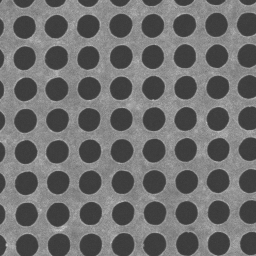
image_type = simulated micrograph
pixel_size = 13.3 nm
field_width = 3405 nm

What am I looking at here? a regular array of holes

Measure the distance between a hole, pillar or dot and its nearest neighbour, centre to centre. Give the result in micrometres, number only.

0.413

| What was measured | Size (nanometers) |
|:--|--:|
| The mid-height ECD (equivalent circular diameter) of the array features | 310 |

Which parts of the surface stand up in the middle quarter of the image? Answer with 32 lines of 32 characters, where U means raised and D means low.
UUUUDDDDUUUUDDDDUUUUDDDDUUUUDDDD
UUUUUDUUUUUUUUUUUUUUUUUUUUUUUUUU
UUUUUUUUUUUUUUUUUUUUUUUUUUUUUUUU
UUUUUDDDUUUUUDDDUUUUUDDDUUUUUDDD
DUUUDDDDDUUUDDDDDUUUDDDDDUUUDDDD
DUUDDDDDDUUUDDDDDUUUDDDDDUUDDDDD
DUUDDDDDDUUDDDDDDUUDDDDDDUUDDDDD
DUUUDDDDDUUUDDDDDUUUDDDDDUUUDDDD
UUUUDDDDUUUUUDDDUUUUUDDDUUUUUDDD
UUUUUUUUUUUUUUUUUUUUUUUUUUUUUUUU
UUUUUUUUUUUUUUUUUUUUUUUUUUUUUUUU
UUUUUDDDUUUUUDDDUUUUUDDDUUUUUDDD
DUUUDDDDDUUUDDDDDUUUDDDDDUUUDDDD
DUUUDDDDDUUDDDDDDUUUDDDDDUUUDDDD
DUUDDDDDDUUUDDDDDUUUDDDDDUUUDDDD
DUUUDDDDDUUUDDDDDUUUDDDDDUUUDDDD
UUUUUDDDUUUUUDDUUUUUUDDDUUUUUDDU
UUUUUUUUUUUUUUUUUUUUUUUUUUUUUUUU
UUUUUUUUUUUUUUUUUUUUUUUUUUUUUUDU
UUUUUDDDUUUUUDDDUUUUDDDDDUUUUDDD
DUUUDDDDDUUUDDDDDUUUDDDDDUUUDDDD
DUUUDDDDDUUUDDDDDUUUDDDDDDUUDDDD
DUUUDDDDDUUUDDDDDUUUDDDDDUUUDDDD
DUUUDDDDDUUUDDDDDUUUDDDDDUUUDDDD
UUUUUDDDUUUUUDDDUUUUUUDUUUUUUUDU
UUUUUUUUUUUUUUUUUUUUUUUUUUUUUUUU
UUUUUUUUUUUUUUDUUUUUUUUUUUUUUUUU
DUUUUDDDDUUUUDDDDUUUDDDDDUUUUDDD
DUUUDDDDDUUUDDDDDDUUDDDDDUUUDDDD
DDUUDDDDDUUUDDDDDDUUDDDDDDUUDDDD
DUUUDDDDDUUUDDDDDUUUDDDDDUUUDDDD
DUUUDDDDDUUUDDDDDUUUDDDDDUUUDDDD